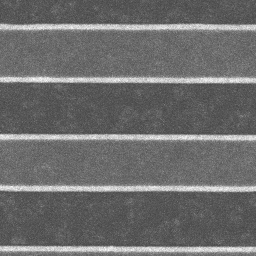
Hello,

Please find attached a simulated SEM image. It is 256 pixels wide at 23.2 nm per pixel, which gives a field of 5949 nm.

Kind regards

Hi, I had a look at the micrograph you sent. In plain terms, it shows one or a few lines or trenches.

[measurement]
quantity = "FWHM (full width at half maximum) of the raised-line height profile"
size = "1210 nm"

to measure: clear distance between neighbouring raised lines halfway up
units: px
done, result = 58.6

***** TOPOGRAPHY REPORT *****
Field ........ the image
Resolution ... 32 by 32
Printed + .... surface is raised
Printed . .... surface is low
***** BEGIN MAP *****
................................
................................
................................
++++++++++++++++++++++++++++++++
++++++++++++++++++++++++++++++++
++++++++++++++++++++++++++++++++
++++++++++++++++++++++++++++++++
++++++++++++++++++++++++++++++++
++++++++++++++++++++++++++++++++
++++++++++++++++++++++++++++++++
................................
................................
................................
................................
................................
................................
................................
++++++++++++++++++++++++++++++++
++++++++++++++++++++++++++++++++
++++++++++++++++++++++++++++++++
++++++++++++++++++++++++++++++++
++++++++++++++++++++++++++++++++
++++++++++++++++++++++++++++++++
.....++++++++++++++.++++++++++++
................................
................................
................................
................................
................................
................................
................................
++++++++++++++++++++++++++++++++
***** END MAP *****